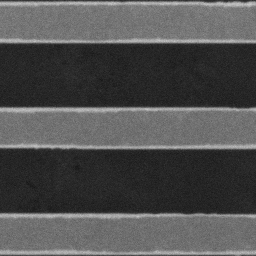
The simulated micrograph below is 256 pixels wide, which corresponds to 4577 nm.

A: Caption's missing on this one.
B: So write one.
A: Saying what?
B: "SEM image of lines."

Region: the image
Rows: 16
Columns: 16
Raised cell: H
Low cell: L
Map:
HHHHHHHHHHHHHHHH
HHHHHHHHHHHHHHHH
HHHHHHHHHHHHHHHH
LLLLLLLLLLLLLLLL
LLLLLLLLLLLLLLLL
LLLLLLLLLLLLLLLL
LLLLLLLLLLLLLLLL
HHHHHHHHHHHHHHHH
HHHHHHHHHHHHHHHH
LLLLLLLLLLLLLLLL
LLLLLLLLLLLLLLLL
LLLLLLLLLLLLLLLL
LLLLLLLLLLLLLLLL
HHHHHHHHHHHHHHHH
HHHHHHHHHHHHHHHH
HHHHHHHHHHHHHHHH